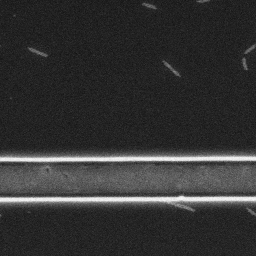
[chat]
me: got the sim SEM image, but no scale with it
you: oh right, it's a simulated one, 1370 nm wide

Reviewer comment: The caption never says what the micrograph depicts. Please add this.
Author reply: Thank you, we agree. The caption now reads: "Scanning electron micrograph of one or a few lines or trenches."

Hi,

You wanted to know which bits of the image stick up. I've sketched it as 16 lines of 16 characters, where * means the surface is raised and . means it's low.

****************
****************
****************
****************
****************
****************
****************
****************
****************
****************
................
................
****************
****************
****************
****************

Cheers